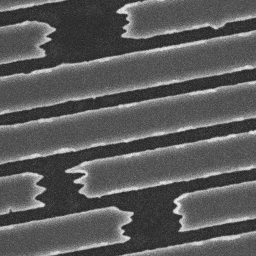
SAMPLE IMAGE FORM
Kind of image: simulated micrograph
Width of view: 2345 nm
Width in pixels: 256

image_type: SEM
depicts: parallel lines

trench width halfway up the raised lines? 115 nm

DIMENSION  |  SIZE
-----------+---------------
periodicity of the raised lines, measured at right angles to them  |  451 nanometres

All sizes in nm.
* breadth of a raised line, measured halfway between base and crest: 334